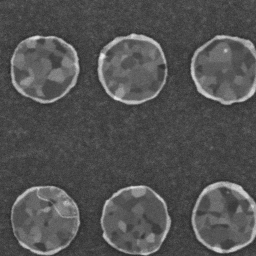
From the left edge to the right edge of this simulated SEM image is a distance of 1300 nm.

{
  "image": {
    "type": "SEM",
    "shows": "raised bodies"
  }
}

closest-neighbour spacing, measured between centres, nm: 456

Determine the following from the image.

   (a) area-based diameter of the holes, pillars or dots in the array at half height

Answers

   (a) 0.343 µm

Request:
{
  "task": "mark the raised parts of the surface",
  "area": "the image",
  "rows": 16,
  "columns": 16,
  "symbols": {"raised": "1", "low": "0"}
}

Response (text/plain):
0000000000000000
0000000000000000
0011000010000110
0111101111001111
0111101111001111
0111000111001111
0000000000000000
0000000000000000
0000000000000000
0000000000000000
0000000000000000
0000000000000000
0111000111001111
0111101111001111
0111101111001111
0011000111000110